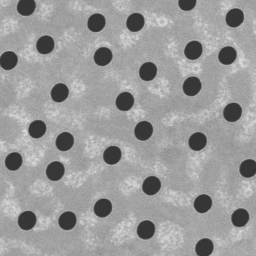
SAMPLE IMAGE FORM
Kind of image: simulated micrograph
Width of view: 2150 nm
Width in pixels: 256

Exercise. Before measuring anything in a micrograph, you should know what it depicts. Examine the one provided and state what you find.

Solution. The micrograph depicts a regular array of holes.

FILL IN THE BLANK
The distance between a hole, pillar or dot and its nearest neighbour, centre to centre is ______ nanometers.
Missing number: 320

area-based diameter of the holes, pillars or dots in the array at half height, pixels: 18.6